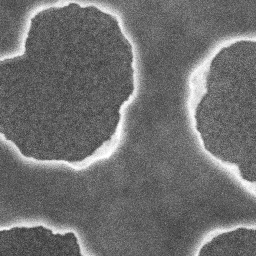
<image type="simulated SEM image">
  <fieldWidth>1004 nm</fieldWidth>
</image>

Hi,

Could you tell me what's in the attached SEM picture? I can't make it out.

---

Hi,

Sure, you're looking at holes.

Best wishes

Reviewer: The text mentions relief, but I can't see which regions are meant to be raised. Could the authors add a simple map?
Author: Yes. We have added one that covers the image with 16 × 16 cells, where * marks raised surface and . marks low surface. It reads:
***...**********
**.....*********
**......********
*.......*****...
........*****...
........****....
........****....
.......*****....
.......******...
*.....*******...
**************..
****************
****************
****************
...***********..
.....********...